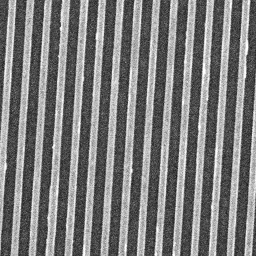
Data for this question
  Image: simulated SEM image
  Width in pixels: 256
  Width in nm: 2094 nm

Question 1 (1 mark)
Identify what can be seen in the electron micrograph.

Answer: parallel lines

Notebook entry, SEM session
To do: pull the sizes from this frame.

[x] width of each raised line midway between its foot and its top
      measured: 6.74 pixels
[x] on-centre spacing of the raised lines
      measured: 147 nm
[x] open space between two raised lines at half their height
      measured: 89.8 nanometers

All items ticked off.